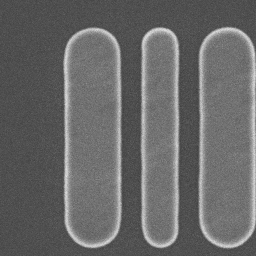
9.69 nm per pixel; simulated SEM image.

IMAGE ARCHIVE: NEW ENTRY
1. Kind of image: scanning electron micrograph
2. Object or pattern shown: groups of lines, slits or small figures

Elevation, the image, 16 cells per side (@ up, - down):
----------------
----------------
----@@@--@@--@@@
----@@@--@@--@@@
----@@@--@@--@@@
----@@@--@@--@@@
----@@@--@@--@@@
----@@@--@@--@@@
----@@@--@@--@@@
----@@@--@@--@@@
----@@@--@@--@@@
----@@@--@@--@@@
----@@@--@@--@@@
----@@@--@@--@@@
----@@@--@@--@@@
----------------